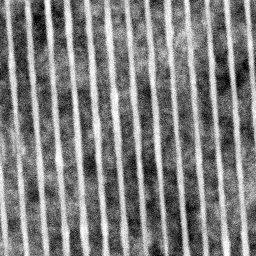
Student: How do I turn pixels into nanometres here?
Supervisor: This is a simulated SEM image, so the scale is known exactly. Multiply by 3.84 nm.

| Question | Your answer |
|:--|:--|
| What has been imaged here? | parallel lines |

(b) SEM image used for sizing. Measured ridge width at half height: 0.0158 microns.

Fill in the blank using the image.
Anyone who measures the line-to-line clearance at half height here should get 60.8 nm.